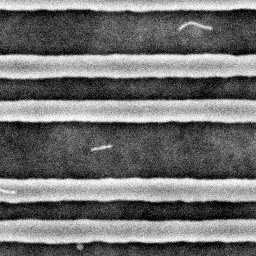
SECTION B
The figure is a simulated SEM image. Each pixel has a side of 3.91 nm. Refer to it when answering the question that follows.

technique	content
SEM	lines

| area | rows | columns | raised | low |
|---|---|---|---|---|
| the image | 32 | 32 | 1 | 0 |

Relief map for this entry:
11111111111111111111111111111111
00000000000000000000000000000000
00000000000000000000000000000000
00000000000000000000000000000000
00000000000000000000000000000000
00000000000000000000000000000000
00000000000000000000000000000000
11111111111111111111111111111111
11111111111111111111111111111111
11111110000100111000100010000000
00000000000000000000000000000000
00000000000000000000000000000000
00000000000000000000000000000000
11111111111111111111111111111111
11111111111111111111111111111111
00000000000000000000000000000000
00000000000000000000000000000000
00000000000000000000000000000000
00000000000000000000000000000000
00000000000000000000000000000000
00000000000000000000000000000000
00000000000000000000000000000000
00000000000000000000000000000000
11111111111111111111111111111111
11111111111111111111111111111111
00000000000000000000000000000000
00000000000000000000000000000000
00000000000000000000000000000000
11111111111111111111111111111111
11111111111111111111111111111111
00000000000000000000000000000000
00000000000000000000000000000000